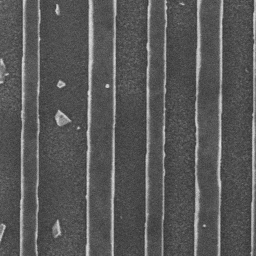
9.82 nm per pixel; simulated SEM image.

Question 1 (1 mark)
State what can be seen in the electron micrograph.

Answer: lines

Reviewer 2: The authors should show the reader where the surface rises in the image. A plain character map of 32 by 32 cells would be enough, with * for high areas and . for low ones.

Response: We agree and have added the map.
...**......***.....**....***....
...**......***.....**....***....
...**......***.....**....***....
...**......***.....**....***....
...**......***.....**....***....
...**......***.....**....***....
...**......***.....**....***....
...**......***.....**....***....
...**......***....***....***....
...**......***....***....***....
...**......***....***....***....
...**......***....***....***....
...**......***....***....***....
...**......***....***....***....
...**..*...***....***...****....
...**......***....***...****....
...**......***....***....***....
...**......***....***....***....
...**......***....**.....***....
...**......***....***....**.....
...**......***....**....***.....
...**......***....***...***.....
...**......***....**....***.....
...**......***....**.....**.....
...**......***....**.....**.....
...**......***....**.....**....*
...**......***....**.....**....*
...**......***....**....***....*
...**......***....**....***....*
...**......***....**....***....*
...*.......***....**....***....*
...**......***....**....***....*